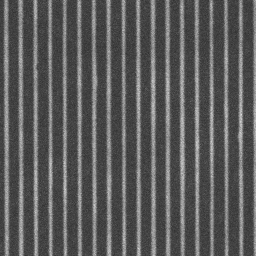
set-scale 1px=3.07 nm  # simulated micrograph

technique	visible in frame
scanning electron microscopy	parallel lines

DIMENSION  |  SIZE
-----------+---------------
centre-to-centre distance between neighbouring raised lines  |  0.0449 microns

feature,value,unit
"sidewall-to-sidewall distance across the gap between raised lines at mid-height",11.5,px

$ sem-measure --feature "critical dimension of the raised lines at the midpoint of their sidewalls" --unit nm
11.9